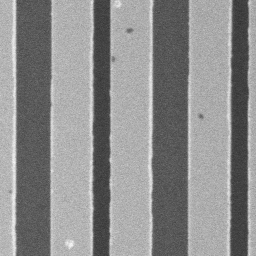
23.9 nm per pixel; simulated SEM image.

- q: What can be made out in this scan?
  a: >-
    lines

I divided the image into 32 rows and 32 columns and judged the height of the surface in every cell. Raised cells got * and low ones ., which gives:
**.....*****..*****.....*****..*
**.....*****..*****.....*****..*
**.....*****..*****.....*****..*
**.....*****..*****.....*****..*
**.....*****..*****.....*****..*
**.....*****..*****.....*****..*
**.....*****..*****.....*****..*
**.....*****..*****.....*****..*
**.....*****..*****.....*****..*
**.....*****..*****.....*****..*
**....******..*****.....*****..*
**....******..*****.....*****..*
**.....*****..*****.....*****..*
**....******..*****.....*****..*
**....******..*****.....*****..*
**....******..*****.....*****..*
**....******..*****.....*****..*
**....******..*****.....*****..*
**....******..*****.....*****..*
**....******..*****.....*****..*
**....******..*****.....*****..*
**....******..*****.....*****..*
**....******..*****.....*****..*
**....******..*****.....*****..*
**....******..*****.....*****..*
**....******..*****.....*****..*
**....******..*****.....*****..*
**....******..*****.....*****..*
**....******..*****.....*****..*
**....******..*****.....*****..*
**....******..*****.....*****..*
**....******..*****.....*****..*